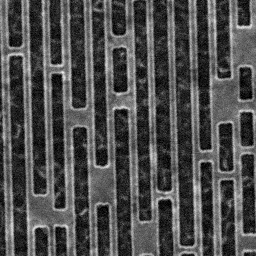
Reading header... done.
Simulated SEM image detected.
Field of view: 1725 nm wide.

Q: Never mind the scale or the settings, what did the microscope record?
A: parallel lines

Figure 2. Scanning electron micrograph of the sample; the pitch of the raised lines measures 141 nm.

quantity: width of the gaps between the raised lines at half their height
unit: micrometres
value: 0.107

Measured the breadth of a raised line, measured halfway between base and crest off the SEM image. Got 0.0362 microns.